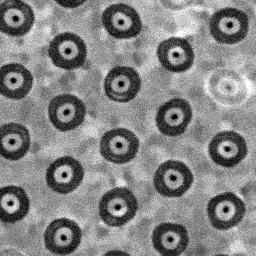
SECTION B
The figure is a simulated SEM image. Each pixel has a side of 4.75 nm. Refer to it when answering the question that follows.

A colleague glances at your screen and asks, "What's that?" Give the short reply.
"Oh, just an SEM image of a regular array of ring-shaped grooves with a dot in the middle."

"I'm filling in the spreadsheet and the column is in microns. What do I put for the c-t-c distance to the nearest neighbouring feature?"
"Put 0.29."